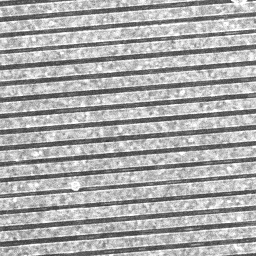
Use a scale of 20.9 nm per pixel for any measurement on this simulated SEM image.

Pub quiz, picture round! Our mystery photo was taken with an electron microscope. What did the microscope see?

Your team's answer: parallel lines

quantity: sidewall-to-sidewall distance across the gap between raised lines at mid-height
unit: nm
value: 112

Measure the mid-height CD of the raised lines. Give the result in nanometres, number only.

224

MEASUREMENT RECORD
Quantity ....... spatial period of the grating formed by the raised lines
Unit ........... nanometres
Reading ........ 334